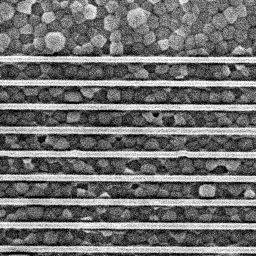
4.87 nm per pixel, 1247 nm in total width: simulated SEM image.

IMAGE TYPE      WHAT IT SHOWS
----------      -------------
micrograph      parallel lines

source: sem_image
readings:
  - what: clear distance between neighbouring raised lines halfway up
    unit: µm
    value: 0.0888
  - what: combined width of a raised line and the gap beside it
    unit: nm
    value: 115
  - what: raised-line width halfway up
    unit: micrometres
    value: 0.0256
